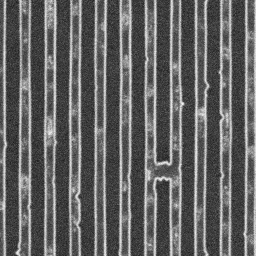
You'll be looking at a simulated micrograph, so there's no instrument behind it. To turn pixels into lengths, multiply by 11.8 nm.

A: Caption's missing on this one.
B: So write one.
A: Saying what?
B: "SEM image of parallel lines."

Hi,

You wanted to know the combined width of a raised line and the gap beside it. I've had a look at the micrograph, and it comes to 295 nanometers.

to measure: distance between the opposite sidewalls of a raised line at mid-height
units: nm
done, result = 112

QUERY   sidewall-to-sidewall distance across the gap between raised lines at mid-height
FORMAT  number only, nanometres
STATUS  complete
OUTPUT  180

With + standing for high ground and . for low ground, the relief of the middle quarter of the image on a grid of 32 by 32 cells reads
..++....++.....++....++....++...
..++....++.....++....++....++...
..++....++....+++....++....++...
..++....++....+++....++....++...
..++....++....+++...+++....++...
..++....++....+++...+++....++...
..++....++....+++...+++....++...
..++....++....+++...+++....++...
..++....++....+++...+++....++...
..++....++....+++...+++....++...
..++....++....+++...+++....++...
..++....++....+++...+++....++...
..++....++....+++....++....++...
..++....++....+++....++....++...
..++....++....++.....++....++...
..++....++....++.....++....++...
..++....++....++.....++....++...
..++....++....++.....++....++...
..++....++....++.....++....++...
..++....++....++.....++....++...
..++....++....++.....++....++...
..++....++....+++....++....++...
..++....++....+++....++....++...
..++....++....++.....++....++...
..++....++....++.....++....++...
..++....++....++.....++++++++...
..++....++....++.....++++++++...
..++....++....++.....++++++++...
..++....++....++.....++++++++...
..++....++....++.....++....++...
..++....++....++.....++....++...
..++....++....++.....++....++...